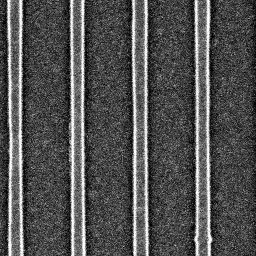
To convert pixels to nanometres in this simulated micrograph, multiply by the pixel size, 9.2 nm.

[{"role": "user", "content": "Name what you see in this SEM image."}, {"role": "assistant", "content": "one or a few lines or trenches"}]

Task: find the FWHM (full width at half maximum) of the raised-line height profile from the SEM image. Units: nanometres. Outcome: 106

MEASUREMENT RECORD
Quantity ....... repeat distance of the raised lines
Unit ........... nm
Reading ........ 574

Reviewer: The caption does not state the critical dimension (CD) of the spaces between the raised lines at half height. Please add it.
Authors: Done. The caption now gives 467 nanometres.